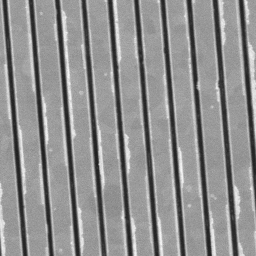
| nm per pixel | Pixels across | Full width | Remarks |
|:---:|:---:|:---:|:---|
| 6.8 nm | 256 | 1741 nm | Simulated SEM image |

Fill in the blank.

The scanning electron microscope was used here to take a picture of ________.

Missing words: parallel lines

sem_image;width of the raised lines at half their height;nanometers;133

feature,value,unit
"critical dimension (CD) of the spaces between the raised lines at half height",0.0457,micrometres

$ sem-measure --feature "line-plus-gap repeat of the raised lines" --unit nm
178